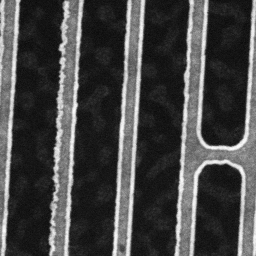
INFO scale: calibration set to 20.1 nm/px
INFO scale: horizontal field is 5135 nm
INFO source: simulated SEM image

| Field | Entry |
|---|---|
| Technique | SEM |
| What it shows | one or a few lines or trenches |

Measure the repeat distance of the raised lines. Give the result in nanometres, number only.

1260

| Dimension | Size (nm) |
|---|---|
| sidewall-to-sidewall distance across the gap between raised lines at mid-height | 979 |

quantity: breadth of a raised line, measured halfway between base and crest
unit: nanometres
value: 275